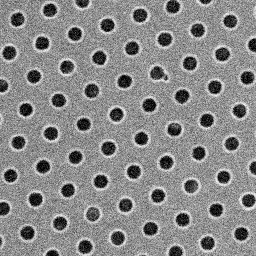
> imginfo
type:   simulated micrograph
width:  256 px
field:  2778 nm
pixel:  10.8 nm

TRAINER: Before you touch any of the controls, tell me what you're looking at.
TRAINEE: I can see a regular array of holes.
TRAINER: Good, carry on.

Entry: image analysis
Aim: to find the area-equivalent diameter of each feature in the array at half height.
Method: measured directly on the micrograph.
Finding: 164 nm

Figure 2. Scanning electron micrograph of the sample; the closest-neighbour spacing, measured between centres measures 0.366 microns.